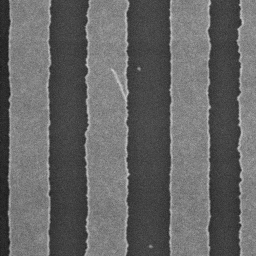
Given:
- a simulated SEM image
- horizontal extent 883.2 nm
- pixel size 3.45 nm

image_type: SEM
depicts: lines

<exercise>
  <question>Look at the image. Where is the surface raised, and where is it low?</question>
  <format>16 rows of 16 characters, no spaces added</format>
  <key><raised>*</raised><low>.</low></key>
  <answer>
.**...**...**..*
.**..***...**..*
.**..***...**..*
.**..***...**..*
.**..***...**..*
.**..***...**..*
.**..***...**..*
.**...**...**..*
.**..***...**..*
.**..***...**..*
.**..***...**..*
.**..***...**..*
.**..***...**..*
.**..***...**..*
.**..***...**..*
.**..***...**..*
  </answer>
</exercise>